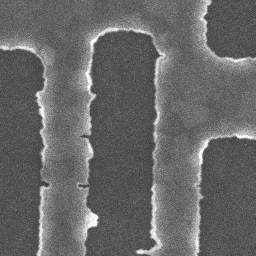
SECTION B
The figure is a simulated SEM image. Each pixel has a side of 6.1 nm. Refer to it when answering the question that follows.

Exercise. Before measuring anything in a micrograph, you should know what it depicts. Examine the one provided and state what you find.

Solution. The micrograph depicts one or a few lines or trenches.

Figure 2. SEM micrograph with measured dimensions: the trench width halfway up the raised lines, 396 nm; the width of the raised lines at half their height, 293 nm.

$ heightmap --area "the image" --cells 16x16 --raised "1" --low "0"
1111111111111000
1111111111111000
1111110001111000
0011110000111100
0001110000111111
0001110000111111
0011110000111111
0001110000111111
0001110000111111
0001110000111000
0001110000111000
0001100000110000
0001100000111000
0001110000110000
0011100001110000
0011100001110000